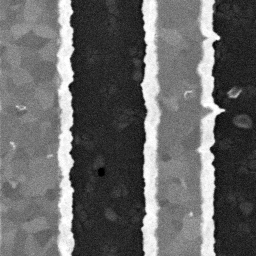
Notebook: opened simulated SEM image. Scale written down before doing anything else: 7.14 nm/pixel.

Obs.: one or a few lines or trenches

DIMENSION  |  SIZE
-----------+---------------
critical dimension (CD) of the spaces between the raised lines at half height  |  593 nm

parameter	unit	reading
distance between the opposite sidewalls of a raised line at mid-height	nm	420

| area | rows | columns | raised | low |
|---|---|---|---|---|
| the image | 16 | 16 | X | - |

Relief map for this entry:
XXXX-----XXXX---
XXXX-----XXXX---
XXXX-----XXXX---
XXXX-----XXXX---
XXXX-----XXXX---
XXXX-----XXXX---
XXXX-----XXXX---
XXXX-----XXXX---
XXXX-----XXXX---
XXXX-----XXXX---
XXXX-----XXXX---
XXXX-----XXXX---
XXXX-----XXXX---
XXXX-----XXXX---
XXXX-----XXXX---
XXXX-----XXXX---